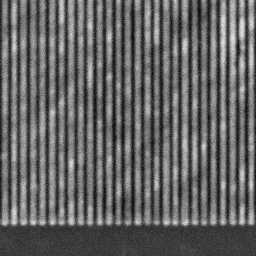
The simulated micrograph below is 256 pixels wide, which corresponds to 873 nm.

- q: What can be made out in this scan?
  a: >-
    parallel lines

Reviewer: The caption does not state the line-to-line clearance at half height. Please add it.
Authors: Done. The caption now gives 3.49 pixels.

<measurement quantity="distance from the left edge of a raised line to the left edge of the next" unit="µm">0.0323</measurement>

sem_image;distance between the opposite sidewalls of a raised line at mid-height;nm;20.5